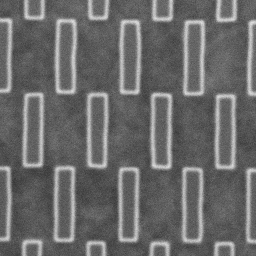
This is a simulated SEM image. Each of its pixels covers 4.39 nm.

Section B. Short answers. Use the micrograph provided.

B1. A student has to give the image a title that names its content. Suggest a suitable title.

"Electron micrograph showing groups of lines, slits or small figures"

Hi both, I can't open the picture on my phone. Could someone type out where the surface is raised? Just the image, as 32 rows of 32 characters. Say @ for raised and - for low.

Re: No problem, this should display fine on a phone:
---@@------@@------@@------@@---
---@@------@@------@@------@@---
----------------------------@---
@------@@------@@------@@------@
@------@@------@@------@@------@
@------@@------@@------@@------@
@------@@------@@------@@------@
@------@@------@@------@@------@
@------@@------@@------@@------@
@------@@------@@------@@------@
@------@@------@@------@@------@
--------@------@@------@@------@
---@@------@@------@@------@@---
---@@------@@------@@------@@---
---@@------@@------@@------@@---
---@@------@@------@@------@@---
---@@------@@------@@------@@---
---@@------@@------@@------@@---
---@@------@@------@@------@@---
---@@------@@------@@------@@---
---@@------@@------@@------@@---
@------@@------@@------@@------@
@------@@------@@------@@------@
@------@@------@@------@@------@
@------@@------@@------@@------@
@------@@------@@------@@------@
@------@@------@@------@@------@
@------@@------@@------@@------@
@------@@------@@------@@------@
@------@@------@@------@@------@
---@@------@@------@@-------@---
---@@------@@------@@------@@---